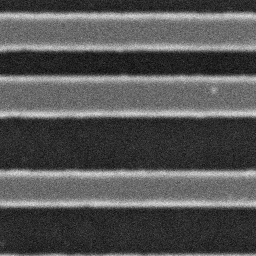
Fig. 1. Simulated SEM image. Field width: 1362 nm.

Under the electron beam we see lines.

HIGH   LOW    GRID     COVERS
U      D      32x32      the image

DDDDDDDDDDDDDDDDDDDDDDDDDDDDDDDD
DDDDDDDDDDDDDDDDDDDDDDDDDDDDDDDD
UUUUUUUUUUUUUUUUUUUUUUUUUUUUUUUU
UUUUUUUUUUUUUUUUUUUUUUUUUUUUUUUU
UUUUUUUUUUUUUUUUUUUUUUUUUUUUUUUU
UUUUUUUUUUUUUUUUUUUUUUUUUUUUUUUU
DDDDDDDDDDDDDDDDDDDDDDDDDDDDDDDD
DDDDDDDDDDDDDDDDDDDDDDDDDDDDDDDD
DDDDDDDDDDDDDDDDDDDDDDDDDDDDDDDD
DDDDDDDDDDDDDDDDDDDDDDDDDDDDDDDD
UUUUUUUUUUUUUUUUUUUUUUUUUUUUUUUU
UUUUUUUUUUUUUUUUUUUUUUUUUUUUUUUU
UUUUUUUUUUUUUUUUUUUUUUUUUUUUUUUU
UUUUUUUUUUUUUUUUUUUUUUUUUUUUUUUU
UDDUUUUUDUUDDDDDDDDDDDDDUUDDDDDD
DDDDDDDDDDDDDDDDDDDDDDDDDDDDDDDD
DDDDDDDDDDDDDDDDDDDDDDDDDDDDDDDD
DDDDDDDDDDDDDDDDDDDDDDDDDDDDDDDD
DDDDDDDDDDDDDDDDDDDDDDDDDDDDDDDD
DDDDDDDDDDDDDDDDDDDDDDDDDDDDDDDD
DDDDDDDDDDDDDDDDDDDDDDDDDDDDDDDD
UUUUUUUUUUUUUUUUUUUUUUUUUUUUUUUU
UUUUUUUUUUUUUUUUUUUUUUUUUUUUUUUU
UUUUUUUUUUUUUUUUUUUUUUUUUUUUUUUU
UUUUUUUUUUUUUUUUUUUUUUUUUUUUUUUU
UUUUUUUUUUUUUUUUUUUUUUUUUUUUUUUU
DDDDDDDDDDDDDDDDDDDDDDDDDDDDDDDD
DDDDDDDDDDDDDDDDDDDDDDDDDDDDDDDD
DDDDDDDDDDDDDDDDDDDDDDDDDDDDDDDD
DDDDDDDDDDDDDDDDDDDDDDDDDDDDDDDD
DDDDDDDDDDDDDDDDDDDDDDDDDDDDDDDD
DDDDDDDDDDDDDDDDDDDDDDDDDDDDDDDD